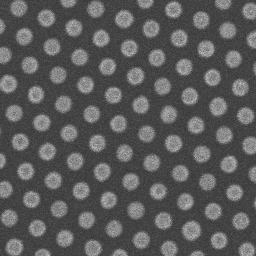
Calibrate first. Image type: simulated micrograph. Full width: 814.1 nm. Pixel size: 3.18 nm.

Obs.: a regular array of raised bodies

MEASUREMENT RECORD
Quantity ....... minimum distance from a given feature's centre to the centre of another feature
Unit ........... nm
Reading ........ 90.5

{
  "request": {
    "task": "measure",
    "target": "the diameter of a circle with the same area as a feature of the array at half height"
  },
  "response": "52.2 nm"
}